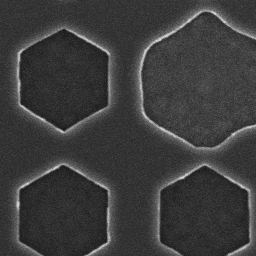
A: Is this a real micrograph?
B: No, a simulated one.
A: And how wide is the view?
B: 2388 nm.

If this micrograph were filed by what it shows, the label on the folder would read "holes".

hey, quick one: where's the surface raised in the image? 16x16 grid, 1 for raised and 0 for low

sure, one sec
1111111111111111
1111111111110011
1110011111000000
1000000110000000
1000000110000000
1000000110000000
1000000110000000
1110011110000000
1111111111100011
1111111111111111
1111111111110111
1100001111100001
1000000111000000
1000000111000000
1000000111000000
1100001111100001